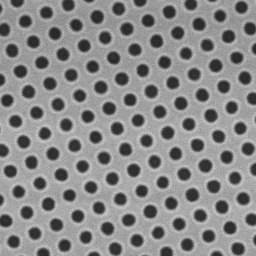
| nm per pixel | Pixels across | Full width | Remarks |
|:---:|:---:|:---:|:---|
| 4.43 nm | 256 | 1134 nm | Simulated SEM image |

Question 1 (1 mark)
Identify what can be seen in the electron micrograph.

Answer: a regular array of holes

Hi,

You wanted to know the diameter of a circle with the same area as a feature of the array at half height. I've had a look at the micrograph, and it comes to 14 px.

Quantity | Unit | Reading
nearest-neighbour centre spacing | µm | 0.0981